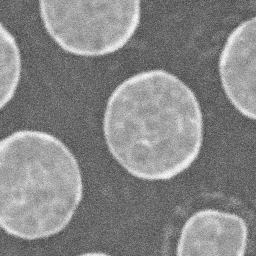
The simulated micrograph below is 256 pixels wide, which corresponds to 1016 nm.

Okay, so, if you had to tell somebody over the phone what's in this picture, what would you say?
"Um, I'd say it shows raised bodies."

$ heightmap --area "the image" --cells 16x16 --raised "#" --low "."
...######.......
...#####.......#
#...####......##
#.............##
#.............##
#.......####..##
.......#####...#
.......#####....
.##....#####....
####...#####....
#####...####....
#####...........
#####...........
####........##..
.##........####.
...........####.